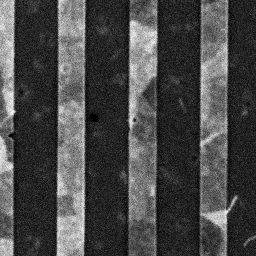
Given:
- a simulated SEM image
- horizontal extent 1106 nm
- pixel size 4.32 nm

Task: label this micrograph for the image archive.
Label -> one or a few lines or trenches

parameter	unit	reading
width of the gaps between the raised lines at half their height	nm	194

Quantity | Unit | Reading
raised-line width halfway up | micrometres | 0.114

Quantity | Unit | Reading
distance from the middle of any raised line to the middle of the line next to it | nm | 308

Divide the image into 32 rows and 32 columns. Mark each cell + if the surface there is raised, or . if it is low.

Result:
++.....+++......++++.....+++....
++.....+++......+++......+++....
++.....+++......+++......+++....
++.....+++......+++......+++....
++.....+++......+++......+++....
++.....+++......+++......+++....
++.....+++......+++......+++....
++.....+++......+++......+++....
++.....+++.......++......+++....
++.....+++......+++......+++....
++.....+++......+++......+++....
++.....+++......+++......+++....
++.....+++......+++......+++....
++.....+++......+++......+++....
++.....+++.......++......+++....
++.....++++......++......+++....
+......++++.....+++......+++....
+......++++.....+++......+++....
++.....++++.....+++......+++....
++.....+++......+++......+++....
++.....+++......+++......+++....
++.....+++......+++......+++....
++.....+++......+++......+++....
++.....+++......+++......+++....
++.....+++......+++......+++....
++.....+++......+++......+++....
++.....+++......+++......+++....
++.....+++......+++......+++....
++.....+++......+++......+++....
++.....+++......+++......+++....
++.....+++......+++......+++....
++.....+++......+++......+++....